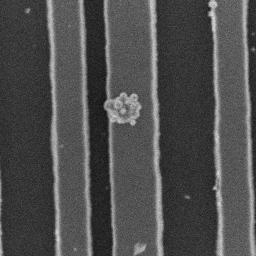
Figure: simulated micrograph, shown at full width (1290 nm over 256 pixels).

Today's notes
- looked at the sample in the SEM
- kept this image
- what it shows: lines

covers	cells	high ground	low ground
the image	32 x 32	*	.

......****...******.......*****.
......*****..******.......*****.
......*****..******.......*****.
......*****..******........****.
.......****..******........****.
.......****..******........****.
.......****..******........****.
.......****..******........****.
.......****..******........****.
.......****..******........****.
.......****..******........****.
.......****..******........****.
.......****..*******.......****.
.......****..*******.......****.
.......****...******.......****.
.......****...******.......****.
.......****...******.......****.
.......****...******.......****.
.......****...******.......****.
.......****...******.......****.
.......****...******.......****.
.......****...******.......*****
.......****...******.......*****
.......****...******.......*****
.......****...******.......*****
.......****...******.......*****
.......****...******........****
.......****...******........****
.......****...******........****
.......****...******........****
.......****...******........****
.......****...******........****